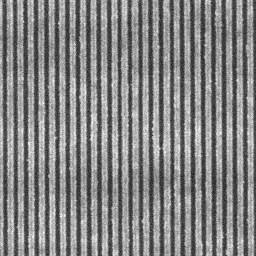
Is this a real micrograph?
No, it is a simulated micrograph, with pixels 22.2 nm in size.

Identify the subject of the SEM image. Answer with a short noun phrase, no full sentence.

parallel lines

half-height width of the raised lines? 97.1 nm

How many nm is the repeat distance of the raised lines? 232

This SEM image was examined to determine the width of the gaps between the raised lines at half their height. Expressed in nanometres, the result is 133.